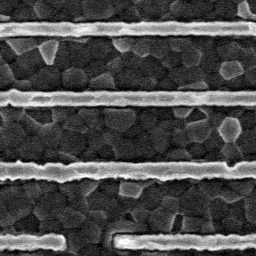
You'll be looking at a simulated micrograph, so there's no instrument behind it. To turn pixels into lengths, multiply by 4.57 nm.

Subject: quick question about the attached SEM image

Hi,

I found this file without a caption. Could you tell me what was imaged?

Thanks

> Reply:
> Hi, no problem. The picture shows one or a few lines or trenches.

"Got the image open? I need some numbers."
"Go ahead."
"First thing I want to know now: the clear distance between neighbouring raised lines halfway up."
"268 nanometres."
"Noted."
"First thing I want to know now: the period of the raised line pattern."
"325 nm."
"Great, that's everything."